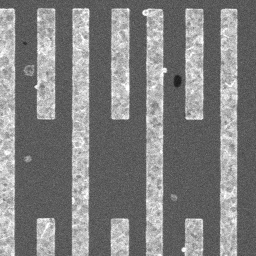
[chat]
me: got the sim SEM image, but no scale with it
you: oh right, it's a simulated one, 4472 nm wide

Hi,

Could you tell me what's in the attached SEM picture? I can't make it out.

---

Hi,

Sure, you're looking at wiring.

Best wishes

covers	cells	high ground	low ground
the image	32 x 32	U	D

DDDDDDDDDDDDDDDDDDDDDDDDDDDDDDDD
UUDDDUUDDUUDDDUUDDUUDDDUUDDDUUDD
UUDDDUUDDUUDDDUUDDUUDDDUUDDDUUDD
UUDDDUUDDUUDDDUUDDUUDDDUUDDDUUDD
UUDDDUUDDUUDDDUUDDUUDDDUUDDDUUDD
UUDDDUUDDUUDDDUUDDUUDDDUUDDDUUDD
UUDDDUUDDUUDDDUUDDUUDDDUUDDDUUDD
UUDDDUUDDUUDDDUUDDUUDDDUUDDDUUDD
UUDUDUUDDUUDDDUUDDUUUDDUUDDDUUDD
UUDDDUUDDUUDDDUUDDUUDDDUUDDDUUDD
UUDDDUUDDUUDDDUUDDUUDDDUUDDDUUDD
UUDDDUUDDUUDDDUUDDUUDDDUUDDDUUDD
UUDDDUUDDUUDDDUUDDUUDDDUUDDDUUDD
UUDDDUUDDUUDDDUUDDUUDDDUUDDDUUDD
UUDDDUUDDUUDDDUUDDUUDDDUUDDDUUDD
UUDDDDDDDUUDDDDDDDUUDDDDDDDDUUDD
UUDDDDDDDUUDDDDDDDUUDDDDDDDDUUDD
UUDDDDDDDUUDDDDDDDUUDDDDDDDDUUDD
UUDDDDDDDUUDDDDDDDUUDDDDDDDDUUDD
UUDDDDDDDUUDDDDDDDUUDDDDDDDDUUDD
UUDDDDDDDUUDDDDDDDUUDDDDDDDDUUDD
UUDDDDDDDUUDDDDDDDUUDDDDDDDDUUDD
UUDDDDDDDUUDDDDDDDUUDDDDDDDDUUDD
UUDDDDDDDUUDDDDDDDUUDDDDDDDDUUDD
UUDDDDDDDUUDDDDDDDUUDDDDDDDDUUDD
UUDDDDDDDUUDDDDDDDUUDDDDDDDDUUDD
UUDDDDDDDUUDDDDDDDUUDDDDDDDDUUDD
UUDDDUDDDUUDDDUUDDUUDDDDUDDDUUDD
UUDDDUUDDUUDDDUUDDUUDDDUUDDDUDDD
UUDDDUUDDUUDDDUUDDUUDDDUUDDDUDDD
UUDDDUUDDUUDDDUUDDUUDDDUUDDDUUDD
UUDDDUUDDUUDDDUUDDUUDDDUUDDDUUDD